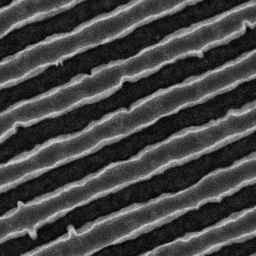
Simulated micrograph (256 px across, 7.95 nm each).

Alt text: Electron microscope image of parallel lines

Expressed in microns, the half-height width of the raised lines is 0.179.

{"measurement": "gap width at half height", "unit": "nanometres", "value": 194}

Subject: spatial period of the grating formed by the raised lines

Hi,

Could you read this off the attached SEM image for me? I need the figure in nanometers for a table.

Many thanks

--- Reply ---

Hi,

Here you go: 375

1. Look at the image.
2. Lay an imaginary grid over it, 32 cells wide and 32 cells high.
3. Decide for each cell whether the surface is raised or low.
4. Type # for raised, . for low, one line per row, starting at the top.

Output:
.########........######........#
######........#######........###
####........#######........#####
##........#######.......#######.
........#######.......#######...
.....########.......#######.....
...#######........#######......#
.#######........######........##
#####........#######........####
###........#######.......#######
#........######........#######..
......########.....########.....
....########......#######.......
..#######........######........#
#######......#######........####
####........#######........#####
#.........######.......########.
......########.......########...
.....#######.......########.....
...#######.......#######........
.######.......########........##
#####........#######.......#####
###........#######.......#######
#.......#######.........######..
......######.........#######....
..#.######.........######.......
..######.......########........#
######.......#######........####
#####......#######........######
#.......#########.......#######.
......########.......#######....
....########.......#######......